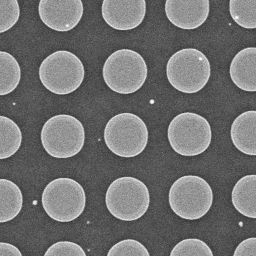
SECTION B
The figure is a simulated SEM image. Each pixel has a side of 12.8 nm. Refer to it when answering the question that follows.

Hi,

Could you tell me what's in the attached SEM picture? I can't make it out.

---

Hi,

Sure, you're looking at an array of small figures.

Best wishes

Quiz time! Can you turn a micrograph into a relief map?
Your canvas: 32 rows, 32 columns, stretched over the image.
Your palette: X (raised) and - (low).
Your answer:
XX---XXXXX---XXXXX---XXXXX---XXX
XX---XXXXX---XXXXX---XXXXX---XXX
XX---XXXXX---XXXXX---XXXXX---XXX
X-----XXX-----XXX------X--------
--------------------------------
--------------------------------
-------XX-----XXX-----XXX-----XX
XX----XXXX---XXXXX---XXXXX---XXX
XX---XXXXX---XXXXX---XXXXX---XXX
XX---XXXXX---XXXXX---XXXXX---XXX
XX---XXXXX---XXXXX---XXXXX---XXX
X------XX------XX------X--------
--------------------------------
--------------------------------
-------XX-----XXX-----XXX-----XX
XX----XXXX---XXXXX---XXXXX---XXX
XXX--XXXXX---XXXXX---XXXXX---XXX
XXX--XXXXX---XXXXX---XXXXX---XXX
XX----XXXX----XXXX----XXXX----XX
X------XX------XX---------------
--------------------------------
--------------------------------
X------XX------XX-----XXX-----XX
XX----XXXX----XXXX---XXXXX---XXX
XXX--XXXXXX--XXXXXX--XXXXXX--XXX
XXX--XXXXXX--XXXXXX--XXXXX---XXX
XX----XXXX----XXXX----XXXX----XX
X------XX------X----------------
--------------------------------
--------------------------------
X------XX------XXX----XXXX----XX
XX----XXXX----XXXX---XXXXX---XXX